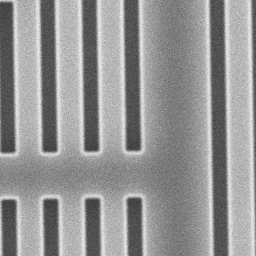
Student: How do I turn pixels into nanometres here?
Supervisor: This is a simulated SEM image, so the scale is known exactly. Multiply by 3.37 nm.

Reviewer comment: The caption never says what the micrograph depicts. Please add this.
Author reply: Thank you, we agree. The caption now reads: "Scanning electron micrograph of groups of lines, slits or small figures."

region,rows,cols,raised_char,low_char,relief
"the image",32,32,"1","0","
00111001110011100111111111001110
00111001110011100111111111001110
00111001110011100011111111001110
00111001110011100011111111001110
00111001110011100011111111001110
00111001110011100011111111001110
00111001110011100011111111001110
00111001110011100011111111001110
00111001110011100011111111001110
00111001110011100011111111001110
00111001110011100011111111001110
00111001110011100011111111001110
00111001110011110011111111001110
00111001110011110011111111000110
00111001110001110011111111000110
00111001110001110011111111000110
00111001110001110011111111000110
00111001110001110011111111000110
00111001110001110011111111000111
11111111111111111111111111000111
11111111111111111111111111000111
11111111111111111111111111000111
11111111111111111111111111000111
11111111111111111111111111000111
11111111111111111111111111000111
00111001110001110011111111000111
00111001110001110011111111000111
00111000110001110011111111000111
00111000110001110011111111000111
00111000110001110011111111000111
00111000110001110011111111000111
00111000110001110011111111100111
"